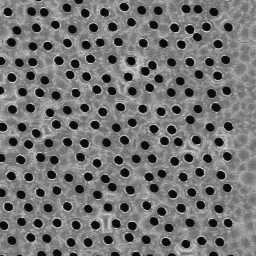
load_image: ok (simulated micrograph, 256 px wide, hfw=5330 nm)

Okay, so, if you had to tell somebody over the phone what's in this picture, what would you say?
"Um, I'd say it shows a regular array of holes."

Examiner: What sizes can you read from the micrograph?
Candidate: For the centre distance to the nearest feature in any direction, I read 322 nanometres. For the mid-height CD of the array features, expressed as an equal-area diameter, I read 188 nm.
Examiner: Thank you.